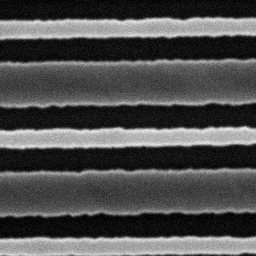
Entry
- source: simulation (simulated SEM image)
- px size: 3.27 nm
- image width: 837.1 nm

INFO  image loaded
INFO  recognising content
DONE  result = lines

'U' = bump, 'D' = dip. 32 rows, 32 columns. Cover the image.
DDDDDDDDDDDDDDDDDDDDDDDDDDDDDDDD
DDDDDDDDDDDDDDDDDDDDDDDDDDDDDDDD
DDDDDDDDUUUDDUDDUDUUUUUUUUUUUUUU
UUUUUUUUUUUUUUUUUUUUUUUUUUUUUUUU
UUUUUUUUUUUUUUUUUUUUUUDDDDDDDDDD
DDDDDDDDDDDDDDDDDDDDDDDDDDDDDDDD
DDDDDDDDDDDDDDDDDDDDDDDDDDDDDDDD
DDDDDDDDDDDDDDDDDDDDDDDDDDDDDDDU
UUUUUUUUUUUUUUUUUUUUUUUUUUUUUUUU
UUUUUUUUUUUUUUUUUUUUUUUUUUUUUUUU
UUUUUUUUUUUUUUUUUUUUUUUUUUUUUUUU
UUUUUUUUUUUUUUUUUUUUUUUUUUUUUUUU
UUUUUUUUUUUUUUUUUUUUUUUUUUUUUUUU
DDDDDDDDDDDDDDDDDDDDDDDDDDDDDDDD
DDDDDDDDDDDDDDDDDDDDDDDDDDDDDDDD
DDDDDDDDDDDDDDDDDDDDDDDDDDDDDDDD
UUUUUUUUUUUUUUUUUUUUUUUUUUUUUUUU
UUUUUUUUUUUUUUUUUUUUUUUUUUUUUUUU
DDUDDDDDDDDDDDDDDDDDDDDDDDDDDDDD
DDDDDDDDDDDDDDDDDDDDDDDDDDDDDDDD
DDDDDDDDDDDDDDDDDDDDDDDDDDDDDDDD
DDDDDDDDDDUUUUUUDUUUUUUUUUUUUUUU
UUUUUUUUUUUUUUUUUUUUUUUUUUUUUUUU
UUUUUUUUUUUUUUUUUUUUUUUUUUUUUUUU
UUUUUUUUUUUUUUUUUUUUUUUUUUUUUUUU
UUUUUUUUUUUUUUUUUUUUUUUUUUUUUUUU
UUUUUUUUUUUUUUUUUUDUUUUUUUUUDUDU
DDDDDDDDDDDDDDDDDDDDDDDDDDDDDDDD
DDDDDDDDDDDDDDDDDDDDDDDDDDDDDDDD
DDDDDDDDDDDDDDDDDDDDDDDDDDDDDDDD
UUUUUUUUUUUUUUUUUUUUUUUUUUUUUUUU
UUUUUUUUUUUUUUUUUUUUUUUUUUUUUUUU